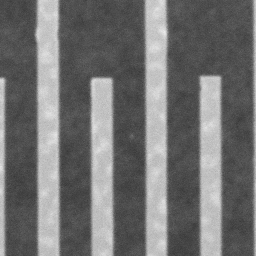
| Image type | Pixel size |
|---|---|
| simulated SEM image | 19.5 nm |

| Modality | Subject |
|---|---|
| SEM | parallel lines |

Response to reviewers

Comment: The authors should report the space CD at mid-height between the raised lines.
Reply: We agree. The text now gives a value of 0.678 µm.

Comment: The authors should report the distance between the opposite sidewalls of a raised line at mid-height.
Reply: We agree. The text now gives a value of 371 nanometres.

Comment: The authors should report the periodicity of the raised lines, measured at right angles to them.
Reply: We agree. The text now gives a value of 1060 nanometres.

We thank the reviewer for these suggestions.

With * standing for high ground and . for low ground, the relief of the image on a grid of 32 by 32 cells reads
.....**...........***...........
.....**...........***...........
.....**...........***...........
.....**...........***...........
.....**...........***...........
.....**...........***...........
.....**...........***...........
.....**...........***...........
.....**...........***...........
.....**...........***...........
.....**.....**....***....**.....
.....**.....**....***....**.....
.....**.....**....***....**.....
.....**.....**....***....**.....
.....**.....**....***....**.....
.....**.....**....***....**.....
.....**.....**....***....**.....
.....**.....**....***....**.....
.....**.....**....***....***....
.....**.....**....***....***....
.....**.....**....***....***....
.....**.....**....***....***....
.....**.....**....***....***....
.....**.....**....***....***....
.....**.....**....***....***....
.....**.....**....***....***....
.....**.....**....***....***....
.....**.....**....***....***....
.....**.....**....***....***....
.....**.....**....***....***....
.....**.....**....***....***....
.....**.....**....***....***....